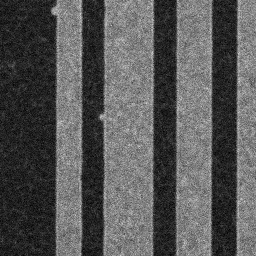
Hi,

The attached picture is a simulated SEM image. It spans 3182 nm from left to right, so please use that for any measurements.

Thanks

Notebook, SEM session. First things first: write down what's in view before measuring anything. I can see one or a few lines or trenches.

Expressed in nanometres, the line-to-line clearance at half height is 320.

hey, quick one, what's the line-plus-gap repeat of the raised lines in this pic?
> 776 nm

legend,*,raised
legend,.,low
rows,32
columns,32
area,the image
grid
.......***...******...****....**
.......***...******...****....**
.......***...******...****....**
.......***...******...****....**
.......***...******...****....**
.......***...******...****....**
.......***...******...****....**
.......***...******...****....**
.......***...******...****....**
.......***...******...****....**
.......***...******...****....**
.......***...******...****....**
.......***...******...****....**
.......***...******...****....**
.......***...******...****....**
.......***...******...****....**
.......***...******...****....**
.......***...******...****....**
.......***...******...****....**
.......***...******...****....**
.......***...******...****....**
.......***...******...****....**
.......***...******...****....**
.......***...******...****....**
.......***...******...****....**
.......***...******...****....**
.......***...******...****....**
.......***...******...****....**
.......***...******...****....**
.......***...******...****....**
.......***...******...****....**
.......***...******...****....**